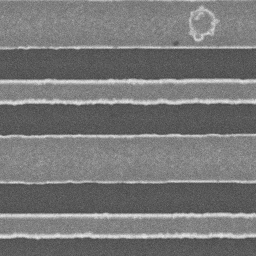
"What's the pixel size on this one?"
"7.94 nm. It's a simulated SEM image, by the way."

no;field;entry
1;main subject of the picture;lines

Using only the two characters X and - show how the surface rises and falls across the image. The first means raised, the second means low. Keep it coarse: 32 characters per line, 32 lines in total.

XXXXXXXXXXXXXXXXXXXXXXXXXXXXXXXX
XXXXXXXXXXXXXXXXXXXXXXXXXXXXXXXX
XXXXXXXXXXXXXXXXXXXXXXXXXXXXXXXX
XXXXXXXXXXXXXXXXXXXXXXXXXXXXXXXX
XXXXXXXXXXXXXXXXXXXXXXXXXXXXXXXX
XXXXXXXXXXXXXXXXXXXXXXXXXXXXXXXX
--------------------------------
--------------------------------
--------------------------------
--------------------------------
XXXXXXXXXXXXXXXXXXXXXXXXXXXXXXXX
XXXXXXXXXXXXXXXXXXXXXXXXXXXXXXXX
XXXXXXXXXXXXXXXXXXXXXXXXXXXXXXXX
--------------------------------
--------------------------------
--------------------------------
--------------------------------
XXXXXXXXXXXXXXXXXXXXXXXXXXXXXXXX
XXXXXXXXXXXXXXXXXXXXXXXXXXXXXXXX
XXXXXXXXXXXXXXXXXXXXXXXXXXXXXXXX
XXXXXXXXXXXXXXXXXXXXXXXXXXXXXXXX
XXXXXXXXXXXXXXXXXXXXXXXXXXXXXXXX
XXXXXXXXXXXXXXXXXXXXXXXXXXXXXXXX
--------------------------------
--------------------------------
--------------------------------
--------------------------------
XXXXXXXXXXXXXXXXXXXXXXXXXXXXXXXX
XXXXXXXXXXXXXXXXXXXXXXXXXXXXXXXX
XXXXXXXXXXXXXXXXXXXXXXXXXXXXXXXX
--------------------------------
--------------------------------